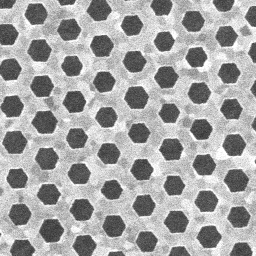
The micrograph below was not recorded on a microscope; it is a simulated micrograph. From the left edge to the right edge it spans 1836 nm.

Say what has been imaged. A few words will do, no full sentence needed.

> a regular array of holes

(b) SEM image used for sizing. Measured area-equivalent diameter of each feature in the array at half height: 166 nm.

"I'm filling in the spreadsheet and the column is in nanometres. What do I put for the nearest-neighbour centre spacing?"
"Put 256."